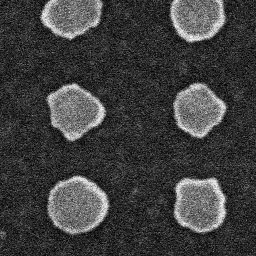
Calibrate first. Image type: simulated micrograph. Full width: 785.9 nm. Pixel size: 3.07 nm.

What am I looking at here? raised bodies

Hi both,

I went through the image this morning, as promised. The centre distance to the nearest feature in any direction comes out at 292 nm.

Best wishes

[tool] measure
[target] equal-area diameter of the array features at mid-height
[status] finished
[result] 0.157 micrometres